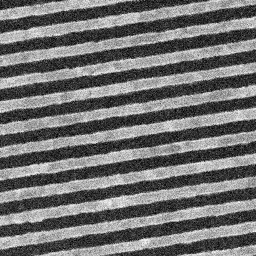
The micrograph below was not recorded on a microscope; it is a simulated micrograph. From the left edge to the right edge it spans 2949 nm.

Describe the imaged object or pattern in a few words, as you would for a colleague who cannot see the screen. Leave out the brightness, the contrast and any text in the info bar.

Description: parallel lines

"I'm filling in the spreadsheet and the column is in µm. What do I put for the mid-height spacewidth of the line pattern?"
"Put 0.152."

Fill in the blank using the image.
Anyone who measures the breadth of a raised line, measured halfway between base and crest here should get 107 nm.